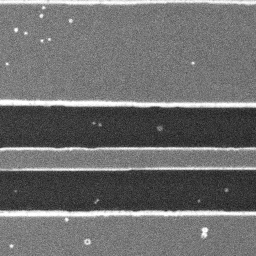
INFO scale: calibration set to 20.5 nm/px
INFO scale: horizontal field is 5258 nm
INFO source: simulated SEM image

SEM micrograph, lines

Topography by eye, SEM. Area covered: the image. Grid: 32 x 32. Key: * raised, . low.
********************************
********************************
********************************
********************************
********************************
********************************
********************************
********************************
********************************
********************************
********************************
********************************
********************************
................................
................................
................................
................................
................................
................................
********************************
********************************
................................
................................
................................
................................
................................
................................
********************************
********************************
********************************
********************************
********************************